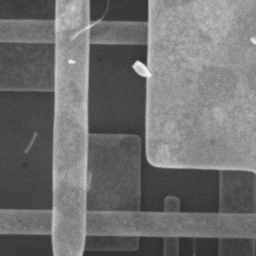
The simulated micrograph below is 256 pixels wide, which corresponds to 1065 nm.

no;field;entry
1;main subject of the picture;wiring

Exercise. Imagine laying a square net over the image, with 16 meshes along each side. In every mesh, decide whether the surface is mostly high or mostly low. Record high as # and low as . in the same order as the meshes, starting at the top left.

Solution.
...###...#######
...###...#######
...###...#######
...###...#######
...###...#######
...##....#######
...##....#######
...##....#######
...##....#######
...##....#######
...##......#####
...##...........
...##...........
...##...........
...##...........
...##...........